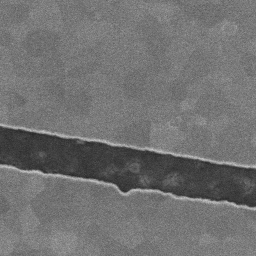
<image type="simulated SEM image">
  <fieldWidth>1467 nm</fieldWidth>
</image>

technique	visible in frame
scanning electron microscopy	one or a few lines or trenches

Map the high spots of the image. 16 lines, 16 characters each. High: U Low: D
UUUUUUUUUUUUUUUU
UUUUUUUUUUUUUUUU
UUUUUUUUUUUUUUUU
UUUUUUUUUUUUUUUU
UUUUUUUUUUUUUUUU
UUUUUUUUUUUUUUUU
UUUUUUUUUUUUUUUU
UUUUUUUUUUUUUUUU
DDDDUUUUUUUUUUUU
DDDDDDDDDDUUUUUU
UDDDDDDDDDDDDDDD
UUUUUUUDDDDDDDDD
UUUUUUUUUUUUDDDD
UUUUUUUUUUUUUUUU
UUUUUUUUUUUUUUUU
UUUUUUUUUUUUUUUU